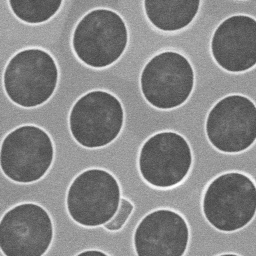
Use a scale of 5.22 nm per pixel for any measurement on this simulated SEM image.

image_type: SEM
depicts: holes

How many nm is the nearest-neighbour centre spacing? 411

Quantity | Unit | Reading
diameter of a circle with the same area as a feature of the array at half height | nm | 288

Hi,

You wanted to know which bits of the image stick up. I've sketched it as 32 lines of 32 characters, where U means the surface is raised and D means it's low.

UDDDDDDDUUUUUUUUUUDDDDDDDUUUUUUU
UUDDDDDUUUUDDDUUUUDDDDDDDUUUUUUU
UUUDDDUUUUDDDDDUUUUDDDDDUUUUDDDD
UUUUUUUUUDDDDDDDUUUUDDDUUUUDDDDD
UUUUUUUUUDDDDDDDUUUUUUUUUUUDDDDD
UUUUUUUUUDDDDDDDUUUUUUUUUUDDDDDD
UUUDDDUUUDDDDDDUUUUUUDUUUUUDDDDD
UDDDDDDUUUDDDDDUUUUDDDDUUUUDDDDD
UDDDDDDUUUUUUUUUUUDDDDDDUUUUDDDU
DDDDDDDUUUUUUUUUUUDDDDDDUUUUUUUU
UDDDDDDUUUUUUUUUUUDDDDDDUUUUUUUU
UDDDDDDUUUUDDUUUUUDDDDDDUUUUUUUU
UUDDDDUUUUDDDDDUUUDDDDDUUUUUDDDU
UUUUUUUUUDDDDDDUUUUUDUUUUUUDDDDD
UUUUUUUUUDDDDDDUUUUUUUUUUUDDDDDD
UUUUUUUUUDDDDDDUUUUUUUUUUUDDDDDD
UDDDDDUUUDDDDDDUUUUUUUUUUUDDDDDD
DDDDDDUUUUDDDDUUUUUDDDDUUUDDDDDD
DDDDDDDUUUUUUUUUUUDDDDDDUUUDDDDU
DDDDDDDUUUUUUUUUUDDDDDDDUUUUUUUU
DDDDDDUUUUUUUUUUUDDDDDDDUUUUUUUU
DDDDDDUUUUDDDUUUUUDDDDDUUUUUUUUU
UUDDDUUUUDDDDDUUUUDDDDDUUUUDDDDU
UUUUUUUUUDDDDDDUUUUUUUUUUUDDDDDD
UUUUUUUUDDDDDDDUUUUUUUUUUUDDDDDD
UUUDUUUUDDDDDDDUUUUUUUUUUDDDDDDD
UDDDDDUUUDDDDDDUUUUDDDUUUUDDDDDD
DDDDDDUUUDDDDDUUUUDDDDDUUUDDDDDU
DDDDDDDUUUUUUUUUUDDDDDDUUUUDDDUU
DDDDDDDUUUUUUUUUUDDDDDDDUUUUUUUU
DDDDDDUUUUUUUUUUUDDDDDDUUUUUUUUU
DDDDDDUUUUDDDUUUUDDDDDDUUUUUUUUU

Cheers